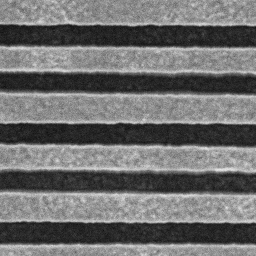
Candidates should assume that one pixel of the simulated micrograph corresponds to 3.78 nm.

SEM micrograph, lines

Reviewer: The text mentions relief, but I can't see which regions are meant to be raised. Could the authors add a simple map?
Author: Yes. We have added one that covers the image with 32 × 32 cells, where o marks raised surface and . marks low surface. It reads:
oooooooooooooooooooooooooooooooo
oooooooooooooooooooooooooooooooo
oooooooooooooooooooooooooooooooo
................................
................................
................................
oooooooooooooooooooooooooooooooo
oooooooooooooooooooooooooooooooo
oooooooooooooooooooooooooooooooo
................................
................................
................................
oooooooooooooooooooooooooooooooo
oooooooooooooooooooooooooooooooo
oooooooooooooooooooooooooooooooo
................................
................................
................................
oooooooooooooooooooooooooooooo..
oooooooooooooooooooooooooooooooo
oooooooooooooooooooooooooooooooo
...............................o
................................
................................
oooooooooooooooooooooooooooooooo
oooooooooooooooooooooooooooooooo
oooooooooooooooooooooooooooooooo
oooooooooooooooooooooooooooooooo
................................
................................
................................
oooooooooooooooooooooooooooooooo